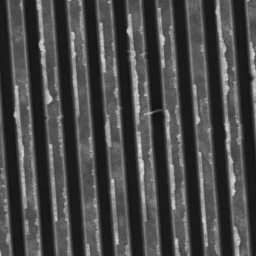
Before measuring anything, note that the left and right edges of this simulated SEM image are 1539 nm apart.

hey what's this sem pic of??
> parallel lines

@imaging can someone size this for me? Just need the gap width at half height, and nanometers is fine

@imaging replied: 74.9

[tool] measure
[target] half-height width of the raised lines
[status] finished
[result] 103 nanometres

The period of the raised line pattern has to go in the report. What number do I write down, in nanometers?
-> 178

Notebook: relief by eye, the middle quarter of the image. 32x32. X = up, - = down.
--XXXX---XXXX----XXXX---XXXX----
--XXXX---XXXX----XXXX---XXXX----
--XXXX---XXXX----XXXX---XXXX----
--XXXX---XXXX----XXXX---XXXX----
--XXXX----XXX----XXXX---XXXXX---
--XXXX----XXXX---XXXX---XXXXX---
--XXXX----XXXX---XXXX----XXX----
--XXXX----XXXX---XXXX----XXXX---
--XXXXX---XXXX---XXXX----XXXX---
---XXXX---XXXX---XXXX----XXXX---
---XXX----XXXX---XXXX----XXXX---
---XXXX---XXXX----XXX----XXXX---
---XXXX---XXXX----XXXX---XXXX---
---XXXX---XXXX----XXXX---XXXX---
---XXXX---XXXX----XXXX---XXXX---
---XXXX---XXXX----XXXX---XXXX---
---XXXX---XXXX----XXXX---XXXX---
---XXXX----XXX----XXXX---XXXXX--
---XXXX----XXX----XXXX---XXXXX--
---XXXX----XXXX---XXXX----XXXX--
---XXXX----XXXX---XXXX----XXXX--
---XXXXX---XXXX---XXXX----XXXX--
---XXXXX---XXXX---XXXX----XXXX--
----XXXX---XXXX---XXXX----XXXX--
----XXXX---XXXX---XXXX----XXXX--
----XXXX---XXXX----XXX----XXXX--
----XXXX---XXXX----XXXX---XXXX--
----XXXX---XXXX----XXXX---XXXX--
----XXXX---XXXX----XXXX---XXXX--
----XXXX---XXXX----XXXX---XXXX--
X---XXXX----XXX----XXXX---XXXX--
X---XXXX----XXX----XXXX---XXXXX-